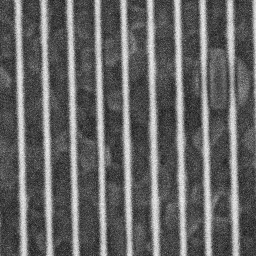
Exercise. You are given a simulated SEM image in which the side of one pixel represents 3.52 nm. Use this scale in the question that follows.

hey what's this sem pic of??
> parallel lines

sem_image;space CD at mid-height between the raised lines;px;21.6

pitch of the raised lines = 0.0931 um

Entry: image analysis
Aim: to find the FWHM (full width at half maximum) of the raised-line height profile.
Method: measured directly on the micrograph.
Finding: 14.1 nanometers